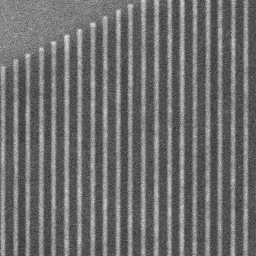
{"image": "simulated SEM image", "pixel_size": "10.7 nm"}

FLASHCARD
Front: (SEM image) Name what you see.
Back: parallel lines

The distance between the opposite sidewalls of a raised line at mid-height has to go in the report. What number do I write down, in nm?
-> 29.4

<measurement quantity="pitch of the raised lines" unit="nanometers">137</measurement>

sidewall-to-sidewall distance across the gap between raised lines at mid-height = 107 nm